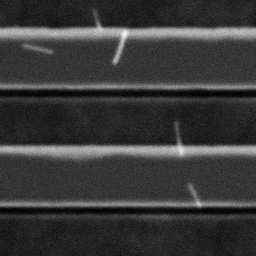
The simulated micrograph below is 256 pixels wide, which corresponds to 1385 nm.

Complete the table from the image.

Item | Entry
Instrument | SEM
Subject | lines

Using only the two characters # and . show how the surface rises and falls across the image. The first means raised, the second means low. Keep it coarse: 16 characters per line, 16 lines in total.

................
................
################
################
################
....#.....######
................
................
................
################
################
################
################
................
................
................